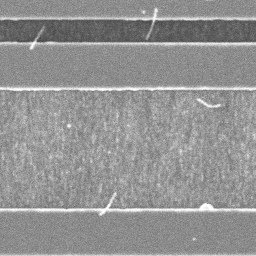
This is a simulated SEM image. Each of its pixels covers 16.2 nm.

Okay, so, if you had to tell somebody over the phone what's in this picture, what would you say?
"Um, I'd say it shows lines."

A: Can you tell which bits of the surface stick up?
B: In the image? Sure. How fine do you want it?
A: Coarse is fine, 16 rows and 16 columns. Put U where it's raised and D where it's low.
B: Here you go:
UUUUUUUUUUUUUUUU
DDDDDDDDDDDDDDDD
DDDDDDDDDDDDDDDD
UUUUUUUUUUUUUUUU
UUUUUUUUUUUUUUUU
UUUUUUUUUUUUUUUU
DDDDDDDDDDDDDDDD
DDDDDDDDDDDDDDDD
DDDDDDDDDDDDDDDD
DDDDDDDDDDDDDDDD
DDDDDDDDDDDDDDDD
DDDDDDDDDDDDDDDD
DDDDDDDDDDDDDDDD
UUUUUUUUUUUUUUUU
UUUUUUUUUUUUUUUU
UUUUUUUUUUUUUUUU